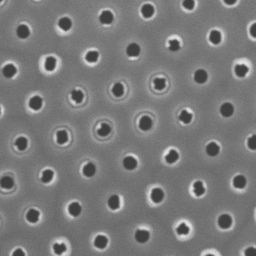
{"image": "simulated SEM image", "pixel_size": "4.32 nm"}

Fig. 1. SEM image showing a regular array of holes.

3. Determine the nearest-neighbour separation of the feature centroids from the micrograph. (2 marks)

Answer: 178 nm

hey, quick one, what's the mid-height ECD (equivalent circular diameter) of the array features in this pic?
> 57.6 nm